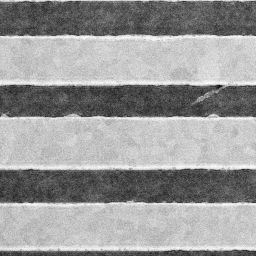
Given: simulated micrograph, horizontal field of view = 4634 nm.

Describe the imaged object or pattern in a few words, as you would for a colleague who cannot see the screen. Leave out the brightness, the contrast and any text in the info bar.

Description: lines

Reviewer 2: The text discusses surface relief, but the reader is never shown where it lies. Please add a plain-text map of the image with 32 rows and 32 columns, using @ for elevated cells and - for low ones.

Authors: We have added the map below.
--------------------------------
--------------------------------
--------------------------------
--------------------------------
-----------------@------@@@--@--
@@@@@@@@@@@@@@@@@@@@@@@@@@@@@@@@
@@@@@@@@@@@@@@@@@@@@@@@@@@@@@@@@
@@@@@@@@@@@@@@@@@@@@@@@@@@@@@@@@
@@@@@@@@@@@@@@@@@@@@@@@@@@@@@@@@
@@@@@@@@@@@@@@@@@@@@@@@@@@@@@@@@
@@@@@@@@@@@@@@@@@@@@@@@@@@@@@@@@
--------------------------------
--------------------------------
--------------------------------
--------------------------------
@@@@@@@@@@@@@@@@@@@@@@@@@@@@@@@@
@@@@@@@@@@@@@@@@@@@@@@@@@@@@@@@@
@@@@@@@@@@@@@@@@@@@@@@@@@@@@@@@@
@@@@@@@@@@@@@@@@@@@@@@@@@@@@@@@@
@@@@@@@@@@@@@@@@@@@@@@@@@@@@@@@@
@@@@@@@@@@@@@@@@@@@@@@@@@@@@@@@@
--------------------------------
--------------------------------
--------------------------------
--------------------------------
@@@@@@@@@@@@@@@@@@@@@@@@@@@@@@@@
@@@@@@@@@@@@@@@@@@@@@@@@@@@@@@@@
@@@@@@@@@@@@@@@@@@@@@@@@@@@@@@@@
@@@@@@@@@@@@@@@@@@@@@@@@@@@@@@@@
@@@@@@@@@@@@@@@@@@@@@@@@@@@@@@@@
@@@@@@@@@@@@@@@@@@@@@@@@@@@@@@@@
--------------------------------